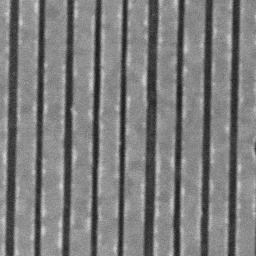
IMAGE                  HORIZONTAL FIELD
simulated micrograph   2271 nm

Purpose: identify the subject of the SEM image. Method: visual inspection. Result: parallel lines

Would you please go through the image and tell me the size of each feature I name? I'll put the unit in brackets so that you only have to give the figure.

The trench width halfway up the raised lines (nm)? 68.7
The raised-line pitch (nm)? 245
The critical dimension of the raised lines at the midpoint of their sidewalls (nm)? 180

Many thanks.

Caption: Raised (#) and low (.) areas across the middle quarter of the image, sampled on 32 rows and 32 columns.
..#####..#####..#####..#####..##
..#####..#####..#####..#####..##
..#####..#####..####...#####..##
..#####..#####..####...#####..##
..#####..#####..####...#####..##
..#####..#####..####...#####..##
..#####..#####..####...#####..##
..#####..#####..####...#####..##
..#####..#####..#####...####..##
..#####..#####..#####..#####..##
..#####..#####..#####..#####..##
..#####..#####..#####..#####..##
..#####..#####..#####..#####..##
..#####..#####..#####..#####..##
..#####..#####..#####..#####..##
..#####..#####..####...#####..##
..#####..#####..####...#####..##
..#####..#####..####...#####..##
..#####..#####..####...#####..##
..#####..#####..####...#####..##
..#####..#####..####...#####..##
..#####..#####..####...#####..##
..#####..#####..####...#####..##
..#####..#####..####...#####..##
..#####..#####.#####...#####.###
..#####..#####.#####...#####.###
..#####..#####.#####...#####.###
..#####..####..#####...#####.###
..#####..####..#####...####..###
..#####..####..#####...####..###
..#####..####..#####...####..###
..#####..####..#####...####..###